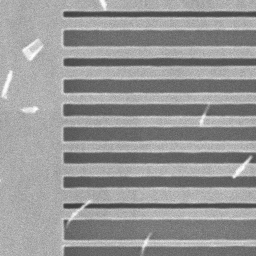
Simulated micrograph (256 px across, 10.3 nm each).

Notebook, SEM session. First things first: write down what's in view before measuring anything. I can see groups of lines, slits or small figures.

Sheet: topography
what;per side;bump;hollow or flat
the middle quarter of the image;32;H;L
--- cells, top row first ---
LLLLLLLLLLLLLLLLLLLLLLLLLLLLLLLL
HHHHHHHHHHHHHHHHHHHHHHHHHHHHHHHH
HHHHHHHHHHHHHHHHHHHHHHHHHHHHHHHH
HHHHHHHHHHHHHHHHHHHHHHHHHHHHHHHH
LLLLLLLLLLLLLLLLLLLLLLLLLLLLLLLL
LLLLLLLLLLLLLLLLLLLLLLLLLLLLLLLL
LLLLLLLLLLLLLLLLLLLLLLLLLLLLLLLL
HHHHHHHHHHHHHHHHHHHHHHHHHHHHHHHH
HHHHHHHHHHHHHHHHHHHHHHHHHHHHHHHH
HHHHHHHHHHHHHHHHHHHHHHHHHHHHHHHH
LLLLLLLLLLLLLLLLLLLLLLLLLLLLLLLL
LLLLLLLLLLLLLLLLLLLLLLLLLLLLLLLL
LLLLLLLLLLLLLLLLLLLLLLLLLLLLLLLL
HHHHHHHHHHHHHHHHHHHHHHHHHHHHHHHH
HHHHHHHHHHHHHHHHHHHHHHHHHHHHHHHH
HHHHHHHHHHHHHHHHHHHHHHHHHHHHHHHH
LLLLLLLLLLLLLLLLLLLLLLLLLLLLLLLL
LLLLLLLLLLLLLLLLLLLLLLLLLLLLLLLL
LLLLLLLLLLLLLLLLLLLLLLLLLLLLLLLL
LLHHHHLLLLLLHHLLLLLLHHHHHHHHHHHH
HHHHHHHHHHHHHHHHHHHHHHHHHHHHHHHH
HHHHHHHHHHHHHHHHHHHHHHHHHHHHHHHH
LLLLLLLLLLLLLLLLLLLLLLLLLLLLLLLL
LLLLLLLLLLLLLLLLLLLLLLLLLLLLLLLL
LLLLLLLLLLLLLLLLLLLLLLLLLLLLLLLL
HHHHHHHHHHHHHHHHHHHHHHHHHHHHHHHH
HHHHHHHHHHHHHHHHHHHHHHHHHHHHHHHH
HHHHHHHHHHHHHHHHHHHHHHHHHHHHHHHH
LLLLLLLLLLLLLLLLLLLLLLLLLLLLLLLL
LLLLLLLLLLLLLLLLLLLLLLLLLLLLLLLL
LLLLLLLLLLLLLLLLLLLLLLLLLLLLLLLL
HHHHHHHHHHHHHHHHHHHHHHHHHHHHHHHH